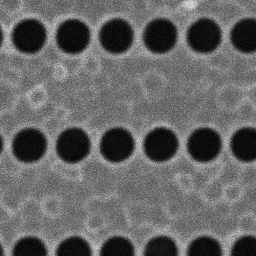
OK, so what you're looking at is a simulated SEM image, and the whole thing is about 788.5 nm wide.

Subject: a regular array of holes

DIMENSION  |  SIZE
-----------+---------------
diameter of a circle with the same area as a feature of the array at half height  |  109 nm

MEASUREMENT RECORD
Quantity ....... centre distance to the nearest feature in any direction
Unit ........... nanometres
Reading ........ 134